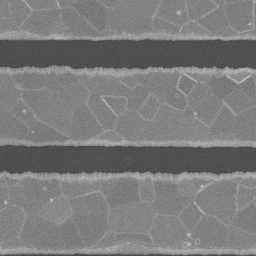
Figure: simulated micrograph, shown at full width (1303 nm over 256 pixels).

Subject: lines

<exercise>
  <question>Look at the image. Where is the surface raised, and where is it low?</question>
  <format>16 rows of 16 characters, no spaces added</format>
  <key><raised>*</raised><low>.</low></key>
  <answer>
****************
****************
................
................
****************
****************
****************
****************
****************
................
................
****************
****************
****************
****************
****************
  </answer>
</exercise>